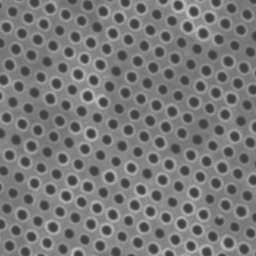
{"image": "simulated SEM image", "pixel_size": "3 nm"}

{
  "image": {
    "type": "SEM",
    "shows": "a regular array of holes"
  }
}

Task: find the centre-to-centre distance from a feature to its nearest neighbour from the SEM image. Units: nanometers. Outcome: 49.9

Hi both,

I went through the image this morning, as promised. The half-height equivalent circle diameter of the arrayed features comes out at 0.029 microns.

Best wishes